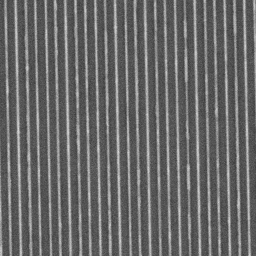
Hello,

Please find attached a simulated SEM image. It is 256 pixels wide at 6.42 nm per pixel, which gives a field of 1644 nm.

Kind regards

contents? parallel lines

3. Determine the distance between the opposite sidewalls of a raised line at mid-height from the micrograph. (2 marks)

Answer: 11.2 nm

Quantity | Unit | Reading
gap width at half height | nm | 49.8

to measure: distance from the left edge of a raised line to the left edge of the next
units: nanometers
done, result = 63.9